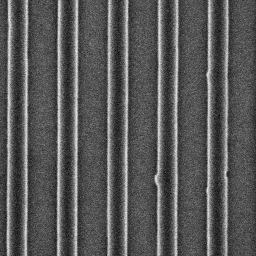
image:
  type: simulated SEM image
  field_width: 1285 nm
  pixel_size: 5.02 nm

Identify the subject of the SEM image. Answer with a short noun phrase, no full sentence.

parallel lines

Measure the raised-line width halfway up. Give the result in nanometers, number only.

96.7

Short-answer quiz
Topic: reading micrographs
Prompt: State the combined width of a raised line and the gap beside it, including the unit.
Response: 0.251 microns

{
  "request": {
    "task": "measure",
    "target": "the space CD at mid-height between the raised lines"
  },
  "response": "155 nanometers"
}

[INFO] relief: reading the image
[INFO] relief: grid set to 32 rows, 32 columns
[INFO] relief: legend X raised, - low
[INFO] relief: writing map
-XX----XXX----XX----XX----XX----
-XX----XXX----XX----XX----XX----
-XX----XXX----XX----XX----XX----
-XX----XXX----XX----XX----XX----
-XX----XXX----XX----XX----XX----
-XX----XXX----XX----XX----XX----
-XX----XXX----XX----XX----XX----
-XX----XXX----XX----XX----XX----
-XX----XXX----XX----XX----XX----
-XX----XXX----XX----XX----XX----
-XX----XXX----XX----XX----XX----
-XX----XXX----XX----XX----XX----
-XX----XXX----XX----XX----XX----
-XX----XXX----XX----XX----XX----
-XX----XXX----XX----XX----XX----
-XX----XXX----XX----XX----XX----
-XX----XX-----XX----XX----XX----
-XX----XXX----XX----XX----XX----
-XX----XXX----XX----XX----XX----
-XX----XXX----XX----XX----XX----
-XX----XXX----XX----XX----XX----
-XX----XXX----XX----XX----XX----
-XX----XXX----XX---XXX----XX----
-XX----XXX----XX----XX----XX----
-XX----XXX----XX----XX----XX----
-XX----XXX----XX----XX----XX----
-XX----XXX----XX----XX----XX----
-XX----XXX----XX----XX----XX----
-XX----XXX----XX----XX----XX----
-XX----XXX----XX----XX----XX----
-XX----XXX----XX----XX----XX----
-XX----XXX----XX----XX----XX----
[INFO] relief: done